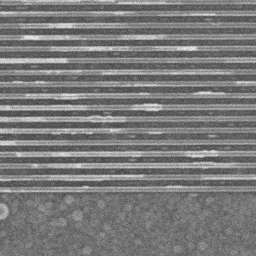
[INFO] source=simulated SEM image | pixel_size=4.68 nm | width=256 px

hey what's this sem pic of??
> parallel lines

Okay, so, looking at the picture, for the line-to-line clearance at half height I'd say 0.0339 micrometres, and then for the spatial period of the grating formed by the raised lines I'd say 0.0547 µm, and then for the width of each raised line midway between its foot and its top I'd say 0.0216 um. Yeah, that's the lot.